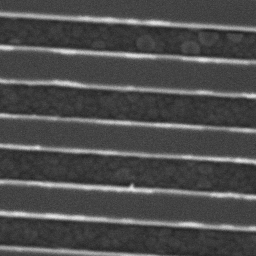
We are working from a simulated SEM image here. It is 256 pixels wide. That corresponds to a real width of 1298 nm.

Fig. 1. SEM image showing one or a few lines or trenches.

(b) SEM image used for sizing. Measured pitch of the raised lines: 339 nanometers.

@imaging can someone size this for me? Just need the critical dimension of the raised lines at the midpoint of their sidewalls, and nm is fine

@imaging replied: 172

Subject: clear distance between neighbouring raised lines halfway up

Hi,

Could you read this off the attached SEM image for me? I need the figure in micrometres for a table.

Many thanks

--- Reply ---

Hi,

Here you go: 0.163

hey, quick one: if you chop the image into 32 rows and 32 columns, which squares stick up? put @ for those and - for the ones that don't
@@@@@@@@@@@@@@@@@@@@@@@@@@@@@@@@
@@@@@@@@@@@@@@@@@@@@@@@@@@@@@@@@
-----------@@@@@@@@@@@@@@@@@@@@@
----------------------------@@@@
--------------------------------
--------------------------------
@@@@@@@@@@@@--------------------
@@@@@@@@@@@@@@@@@@@@@@@@@@@@----
@@@@@@@@@@@@@@@@@@@@@@@@@@@@@@@@
@@@@@@@@@@@@@@@@@@@@@@@@@@@@@@@@
-------@@@@@@@@@@@@@@@@@@@@@@@@@
----------------------@@@@@@@@@@
--------------------------------
--------------------------------
@@@@@---------------------------
@@@@@@@@@@@@@@@@@@@@------------
@@@@@@@@@@@@@@@@@@@@@@@@@@@@@@@@
@@@@@@@@@@@@@@@@@@@@@@@@@@@@@@@@
-@@@@@@@@@@@@@@@@@@@@@@@@@@@@@@@
------------------@@@@@@@@@@@@@@
--------------------------------
--------------------------------
--------------------------------
@@@@@@@@@@@@@@@-@---------------
@@@@@@@@@@@@@@@@@@@@@@@@@@@@@@@-
@@@@@@@@@@@@@@@@@@@@@@@@@@@@@@@@
@@@@@@@@@@@@@@@@@@@@@@@@@@@@@@@@
------------@@@@@@@@@@@@@@@@@@@@
----------------------------@@@@
--------------------------------
--------------------------------
@@@@@@@@@@@---------------------